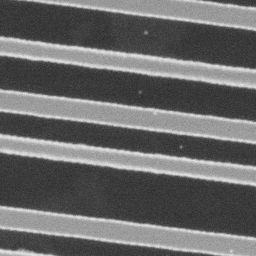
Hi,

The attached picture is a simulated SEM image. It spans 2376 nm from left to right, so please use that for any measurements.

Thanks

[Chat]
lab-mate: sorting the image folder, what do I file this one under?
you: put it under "lines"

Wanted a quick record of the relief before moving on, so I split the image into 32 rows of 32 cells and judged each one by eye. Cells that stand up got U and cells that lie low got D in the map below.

DDDDDDDUUUUUUUUUUUUUUUUUUUUDDDDD
DDDDDDDDDDDDDDDUUUUUUUUUUUUUUUUU
DDDDDDDDDDDDDDDDDDDDDDDUUUUUUUUU
DDDDDDDDDDDDDDDDDDDDDDDDDDDDDDUU
DDDDDDDDDDDDDDDDDDDDDDDDDDDDDDDD
UUUUUUDDDDDDDDDDDDDDDDDDDDDDDDDD
UUUUUUUUUUUUUUDDDDDDDDDDDDDDDDDD
DDDDDDUUUUUUUUUUUUUUUUDDDDDDDDDD
DDDDDDDDDDDDUUUUUUUUUUUUUUUUUDDD
DDDDDDDDDDDDDDDDDDDDDUUUUUUUUUUU
DDDDDDDDDDDDDDDDDDDDDDDDDDDDDUUU
UUDDDDDDDDDDDDDDDDDDDDDDDDDDDDDD
UUUUUUUUUUDDDDDDDDDDDDDDDDDDDDDD
UUUUUUUUUUUUUUUUUUDDDDDDDDDDDDDD
DDDDDUUUUUUUUUUUUUUUUUUUUDDDDDDD
DDDDDDDDDDDDDUUUUUUUUUUUUUUUUUUU
DDDDDDDDDDDDDDDDDDDDDUUUUUUUUUUU
UUUUDDDDDDDDDDDDDDDDDDDDDDDDDUUU
UUUUUUUUUUUUDDDDDDDDDDDDDDDDDDDD
DDDDUUUUUUUUUUUUUUUUDDDDDDDDDDDD
DDDDDDDDDDDDUUUUUUUUUUUUUUUUUDDD
DDDDDDDDDDDDDDDDDDDDUUUUUUUUUUUU
DDDDDDDDDDDDDDDDDDDDDDDDDDDUUUUU
DDDDDDDDDDDDDDDDDDDDDDDDDDDDDDDD
DDDDDDDDDDDDDDDDDDDDDDDDDDDDDDDD
DDDDDDDDDDDDDDDDDDDDDDDDDDDDDDDD
UUUUUUDDDDDDDDDDDDDDDDDDDDDDDDDD
UUUUUUUUUUUUUDDDDDDDDDDDDDDDDDDD
UUUUUUUUUUUUUUUUUUUUUDDDDDDDDDDD
DDDDDDDDDUUUUUUUUUUUUUUUUUUUUUDD
DDDDDDDDDDDDDDDDUUUUUUUUUUUUUUUU
UUDDDDDDDDDDDDDDDDDDDDDDDUUUUUUU